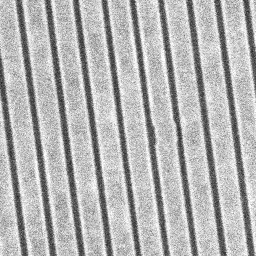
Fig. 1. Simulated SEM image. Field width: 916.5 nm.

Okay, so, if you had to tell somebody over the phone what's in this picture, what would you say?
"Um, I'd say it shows parallel lines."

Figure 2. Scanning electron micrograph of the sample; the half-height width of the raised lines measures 72.3 nm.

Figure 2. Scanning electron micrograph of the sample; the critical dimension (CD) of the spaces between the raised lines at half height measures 27.9 nm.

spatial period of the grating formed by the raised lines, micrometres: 0.101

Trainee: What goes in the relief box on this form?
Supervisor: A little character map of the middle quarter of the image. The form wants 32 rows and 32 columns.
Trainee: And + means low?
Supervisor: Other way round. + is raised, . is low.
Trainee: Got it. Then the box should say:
++++..+++++..+++++..+++++..+++++
++++..+++++...++++...++++...++++
++++...+++++..+++++..+++++..++++
++++...+++++..+++++..+++++..++++
+++++..+++++..+++++..+++++..++++
+++++..+++++..+++++..+++++..++++
+++++..+++++..+++++..+++++..++++
+++++..+++++..+++++..+++++..++++
+++++..+++++..+++++...++++...+++
+++++...++++..++++++..+++++..+++
++++++..+++++..+++++..+++++..+++
.+++++..+++++..+++++..+++++..+++
.+++++..+++++..+++++..+++++..+++
.+++++..+++++..+++++..+++++..+++
.+++++..+++++..+++++..+++++..+++
.+++++..+++++..+++++...+++++.+++
.+++++..+++++..+++++...+++++..++
.+++++...+++++.++++++..+++++..++
.++++++..+++++..+++++..+++++..++
..+++++..+++++..+++++..+++++..++
..+++++..+++++..+++++..+++++..++
..+++++..+++++..+++++..+++++..++
..+++++..+++++..+++++..+++++..++
..+++++..+++++..+++++...++++...+
..+++++...++++..+++++...+++++..+
..++++++..+++++..++++...+++++..+
...+++++..+++++..+++++..+++++..+
+..+++++..+++++..+++++..+++++..+
+..+++++..+++++..+++++..+++++..+
+..+++++..+++++..+++++..+++++..+
+..+++++..+++++..+++++..+++++...
+..+++++..+++++..+++++...+++++..